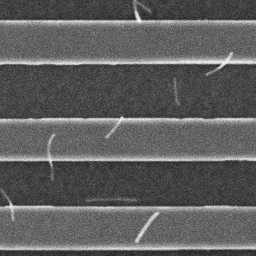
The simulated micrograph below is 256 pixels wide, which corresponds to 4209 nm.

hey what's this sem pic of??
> lines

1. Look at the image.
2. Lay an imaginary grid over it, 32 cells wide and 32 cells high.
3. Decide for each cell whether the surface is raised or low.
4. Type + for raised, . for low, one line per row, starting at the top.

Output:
................................
................................
.................+..............
++++++++++++++++++++++++++++++++
++++++++++++++++++++++++++++++++
++++++++++++++++++++++++++++++++
++++++++++++++++++++++++++++++++
++++++++++++++++++++++++++++++++
................................
................................
................................
................................
................................
................................
................................
++++++++++++++++++++++++++++++++
++++++++++++++++++++++++++++++++
++++++++++++++++++++++++++++++++
++++++++++++++++++++++++++++++++
++++++++++++++++++++++++++++++++
................................
................................
................................
................................
................................
................................
++++++++++++++++++++++++++++++++
++++++++++++++++++++++++++++++++
++++++++++++++++++++++++++++++++
++++++++++++++++++++++++++++++++
++++++++++++++++++++++++++++++++
................................